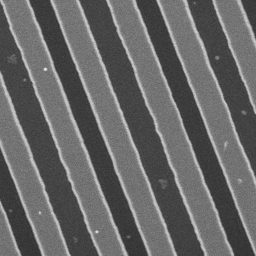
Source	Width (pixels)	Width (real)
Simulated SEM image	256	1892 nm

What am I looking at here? lines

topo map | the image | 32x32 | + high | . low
++++..++++...++++...++++...+++..
.+++...++++...+++...++++...++++.
.++++..++++...++++...+++...++++.
.++++...+++....+++...++++...+++.
..+++...++++...++++..++++...++++
..++++..++++...++++...+++....+++
...+++...+++....+++...++++...+++
...++++..++++...++++..++++...+++
...++++...+++....+++...+++....++
....+++...++++...++++..++++...++
+...++++..++++...++++...+++....+
+...++++...+++....+++...++++...+
+....+++...++++...++++..++++...+
++...++++..++++...++++...++++...
++....+++...+++....++++..++++...
++....++++..++++...++++...+++...
+++...++++...+++....+++...++++..
+++....+++...++++...++++..++++..
++++...++++..++++...++++...+++..
++++...++++...+++....+++...++++.
.+++....+++...++++...++++..++++.
.++++...++++..++++....+++...++++
..+++....+++...++++...++++..++++
..++++...++++..++++...++++...+++
..++++...++++...+++....+++...+++
...+++....+++...++++...++++..+++
+..++++...++++..++++...++++...++
+..++++....+++...++++...+++...++
+...++++...++++..++++...++++...+
++..++++...++++...+++....+++...+
++...+++....+++...++++...++++..+
++...++++...++++..++++...++++...